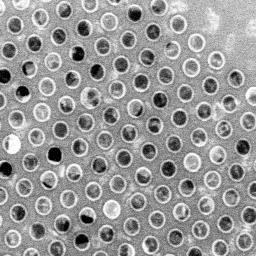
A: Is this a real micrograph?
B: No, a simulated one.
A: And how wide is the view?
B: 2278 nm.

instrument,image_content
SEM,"a regular array of raised bodies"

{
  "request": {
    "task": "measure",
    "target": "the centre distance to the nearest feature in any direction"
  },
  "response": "227 nm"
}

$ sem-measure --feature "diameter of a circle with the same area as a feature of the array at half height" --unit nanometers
147